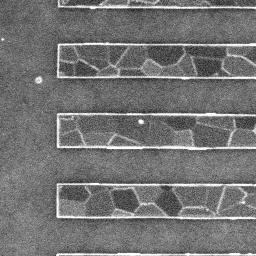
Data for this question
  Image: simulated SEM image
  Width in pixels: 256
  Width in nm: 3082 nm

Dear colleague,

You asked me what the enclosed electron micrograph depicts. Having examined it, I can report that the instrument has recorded wiring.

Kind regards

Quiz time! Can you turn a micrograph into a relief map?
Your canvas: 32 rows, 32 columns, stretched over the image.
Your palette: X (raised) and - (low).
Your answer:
-------XXXXXXXXXXXXXXXXXXXXXXXXX
--------------------------------
--------------------------------
--------------------------------
--------------------------------
--------------------------------
-------XXXXXXXXXXXXXXXXXXXXXXXXX
-------XXXXXXXXXXXXXXXXXXXXXXXXX
-------XXXXXXXXXXXXXXXXXXXXXXXXX
--------XXXXXXXXXXXXXXXXXXXXXXXX
--------------------------------
--------------------------------
--------------------------------
--------------------------------
-------XXXXXXXXXXXXXXXXXXXXXXXXX
-------XXXXXXXXXXXXXXXXXXXXXXXXX
-------XXXXXXXXXXXXXXXXXXXXXXXXX
-------XXXXXXXXXXXXXXXXXXXXXXXXX
---------------------XXXXXXXX-XX
--------------------------------
--------------------------------
--------------------------------
--------------------------------
-------XXXXXXXXXXXXXXXXXXXXXXXXX
-------XXXXXXXXXXXXXXXXXXXXXXXXX
-------XXXXXXXXXXXXXXXXXXXXXXXXX
-------XXXXXXXXXXXXXXXXXXXXXXXXX
--------------------------------
--------------------------------
--------------------------------
--------------------------------
--------------------------------